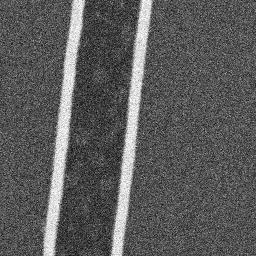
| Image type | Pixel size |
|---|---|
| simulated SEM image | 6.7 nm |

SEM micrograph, one or a few lines or trenches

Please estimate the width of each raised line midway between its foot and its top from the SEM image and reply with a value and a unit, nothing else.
453 nm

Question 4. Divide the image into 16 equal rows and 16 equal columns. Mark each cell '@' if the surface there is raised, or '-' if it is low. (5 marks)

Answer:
-----@@@@-------
-----@@@@-------
-----@@@@-------
----@@@@@-------
----@@@@@-------
----@@@@--------
----@@@@--------
----@@@@--------
----@@@@--------
----@@@@--------
----@@@@--------
----@@@@--------
---@@@@@--------
---@@@@@--------
---@@@@---------
---@@@@---------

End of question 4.